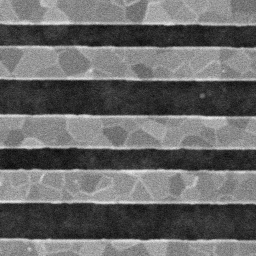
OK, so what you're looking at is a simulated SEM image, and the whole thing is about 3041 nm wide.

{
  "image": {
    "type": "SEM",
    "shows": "lines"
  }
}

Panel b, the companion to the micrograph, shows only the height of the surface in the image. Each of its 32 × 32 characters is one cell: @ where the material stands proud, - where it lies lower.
@@@@@@@@@@@@@@@@@@@@@@@@@@@@@@@@
@@@@@@@@@@@@@@@@@@@@@@@@@@@@@@@@
@@@@@@@@@@@@@@@@@@@@@@@@@@@@@@@@
--------------------------------
--------------------------------
--------------------------------
@@@@@@@@@@@@@@@@@@@@@@@@@@@@@@@@
@@@@@@@@@@@@@@@@@@@@@@@@@@@@@@@@
@@@@@@@@@@@@@@@@@@@@@@@@@@@@@@@@
@@@@@@@@@@@@@@@@@@@@@@@@@@@@@@@@
--------------------------------
--------------------------------
--------------------------------
--------------------------------
@@@-----------------------------
@@@@@@@@@@@@@@@@@@@@@@@@@@@@@@@@
@@@@@@@@@@@@@@@@@@@@@@@@@@@@@@@@
@@@@@@@@@@@@@@@@@@@@@@@@@@@@@@@@
--------------@@@--@@@@-@@@@@@@@
--------------------------------
--------------------------------
@@@@@@@@@@@@@@@@@@@@@@@@@@@@@@@@
@@@@@@@@@@@@@@@@@@@@@@@@@@@@@@@@
@@@@@@@@@@@@@@@@@@@@@@@@@@@@@@@@
@@@@@@@@@@@@@@@@@@@@@@@@@@@@@@@@
--------------------------------
--------------------------------
--------------------------------
--------------------------------
--------------------------------
@@@@@@@@@@@@@@@@@@@@@@@@@@@@@@@@
@@@@@@@@@@@@@@@@@@@@@@@@@@@@@@@@